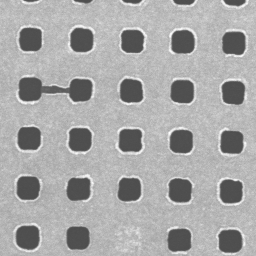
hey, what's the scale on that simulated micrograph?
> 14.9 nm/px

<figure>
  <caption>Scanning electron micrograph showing a regular array of holes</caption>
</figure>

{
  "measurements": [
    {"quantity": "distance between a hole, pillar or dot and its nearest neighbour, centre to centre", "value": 733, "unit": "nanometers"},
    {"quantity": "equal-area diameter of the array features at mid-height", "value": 372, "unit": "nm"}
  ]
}